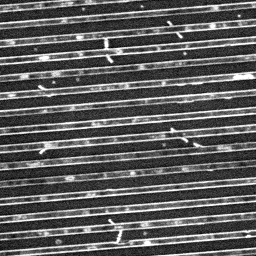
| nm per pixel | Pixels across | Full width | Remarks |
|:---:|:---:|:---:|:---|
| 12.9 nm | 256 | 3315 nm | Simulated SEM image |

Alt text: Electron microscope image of parallel lines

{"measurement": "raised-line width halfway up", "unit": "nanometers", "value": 80.6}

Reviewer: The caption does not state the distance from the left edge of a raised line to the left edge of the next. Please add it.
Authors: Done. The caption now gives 17.5 px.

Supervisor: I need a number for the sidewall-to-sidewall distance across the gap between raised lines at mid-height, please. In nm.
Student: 150